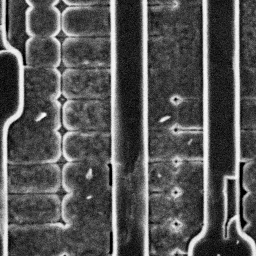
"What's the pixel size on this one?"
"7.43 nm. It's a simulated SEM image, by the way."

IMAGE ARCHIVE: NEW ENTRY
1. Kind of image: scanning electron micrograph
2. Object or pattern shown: wiring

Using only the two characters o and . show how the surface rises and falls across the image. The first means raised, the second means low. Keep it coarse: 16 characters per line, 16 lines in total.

.......oo....oo.
.......oo....oo.
.......oo....oo.
o......oo....oo.
o......oo....oo.
o......oo....oo.
o......oo....oo.
o......oo....oo.
.......oo....oo.
.......oo....oo.
.......oo....oo.
.......oo....oo.
.......oo....oo.
.......oo....oo.
.......oo....oo.
.......oo...oooo